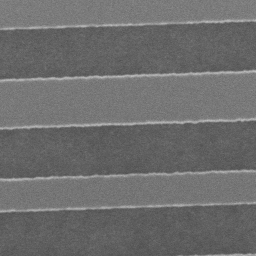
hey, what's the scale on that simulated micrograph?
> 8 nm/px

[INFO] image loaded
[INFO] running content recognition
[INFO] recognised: lines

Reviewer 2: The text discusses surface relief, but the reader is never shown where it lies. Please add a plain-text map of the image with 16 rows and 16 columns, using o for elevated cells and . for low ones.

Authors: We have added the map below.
oooooooooooooooo
ooooooooo.......
................
................
.............ooo
oooooooooooooooo
oooooooooooooooo
oooooooooooooooo
................
................
................
oooooooooooooooo
oooooooooooooooo
................
................
................